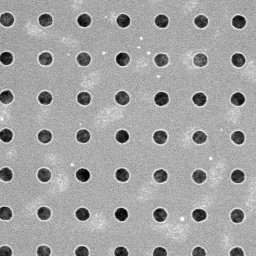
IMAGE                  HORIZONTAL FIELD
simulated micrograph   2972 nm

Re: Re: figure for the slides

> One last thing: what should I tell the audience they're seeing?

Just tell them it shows a regular array of holes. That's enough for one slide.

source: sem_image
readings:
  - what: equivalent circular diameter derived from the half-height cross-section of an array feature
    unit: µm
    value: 0.166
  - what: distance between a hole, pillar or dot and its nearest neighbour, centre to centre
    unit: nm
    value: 445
